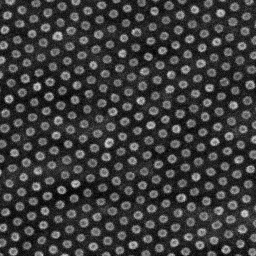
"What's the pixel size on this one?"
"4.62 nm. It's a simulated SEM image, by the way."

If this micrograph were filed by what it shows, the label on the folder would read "a regular array of raised bodies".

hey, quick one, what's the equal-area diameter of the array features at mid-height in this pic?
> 35.3 nanometres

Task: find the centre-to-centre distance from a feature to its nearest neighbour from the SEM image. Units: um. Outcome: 0.0666